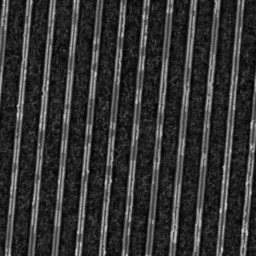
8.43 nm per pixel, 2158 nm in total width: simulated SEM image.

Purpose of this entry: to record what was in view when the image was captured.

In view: parallel lines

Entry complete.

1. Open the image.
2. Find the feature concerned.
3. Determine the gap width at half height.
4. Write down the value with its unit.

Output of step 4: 148 nm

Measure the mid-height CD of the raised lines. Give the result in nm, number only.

49.3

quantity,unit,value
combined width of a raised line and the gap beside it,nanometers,197